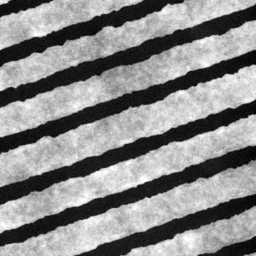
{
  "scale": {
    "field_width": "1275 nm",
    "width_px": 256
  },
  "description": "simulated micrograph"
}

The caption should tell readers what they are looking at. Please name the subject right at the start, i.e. lines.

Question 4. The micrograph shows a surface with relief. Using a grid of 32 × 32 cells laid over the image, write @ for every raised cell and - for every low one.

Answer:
-----@@@@@@@@@@@@-----@@@@@@@@@@
--@@@@@@@@@@@@-----@@@@@@@@@@---
@@@@@@@@@@@------@@@@@@@@@------
@@@@@@@@-----@@@@@@@@@@-------@@
@@@@@------@@@@@@@@@------@@@@@@
@@------@@@@@@@@@@-----@@@@@@@@@
-----@@@@@@@@@@-----@@@@@@@@@@@-
--@@@@@@@@@@------@@@@@@@@@@----
@@@@@@@@------@@@@@@@@@@@------@
@@@@@@------@@@@@@@@@@@-----@@@@
@@@------@@@@@@@@@@@-----@@@@@@@
------@@@@@@@@@@@-----@@@@@@@@@@
---@@@@@@@@@@@------@@@@@@@@@@@@
@@@@@@@@@@------@@@@@@@@@@@@----
@@@@@@@@------@@@@@@@@@@@@-----@
@@@@@------@@@@@@@@@@@@------@@@
@@------@@@@@@@@@@@@@-----@@@@@@
-----@@@@@@@@@@@@------@@@@@@@@@
--@@@@@@@@@@@@------@@@@@@@@@@--
@@@@@@@@@@@------@@@@@@@@@@-----
@@@@@@@@@------@@@@@@@@@@------@
@@@@@@------@@@@@@@@@@------@@@@
@@@-----@@@@@@@@@@@------@@@@@@@
------@@@@@@@@@@------@@@@@@@@@@
---@@@@@@@@@@------@@@@@@@@@@@@-
@@@@@@@@@@------@@@@@@@@@@@-----
@@@@@@@@-----@@@@@@@@@@@@------@
@@@@@-----@@@@@@@@@@@-------@@@@
@@-----@@@@@@@@@@@@------@@@@@@@
-----@@@@@@@@@@@------@@@@@@@@@@
-@@@@@@@@@@@@-------@@@@@@@@@---
@@@@@@@@@@@-----@@@@@@@@@@@-----